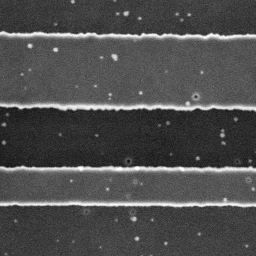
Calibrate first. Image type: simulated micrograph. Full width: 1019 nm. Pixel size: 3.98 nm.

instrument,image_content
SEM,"lines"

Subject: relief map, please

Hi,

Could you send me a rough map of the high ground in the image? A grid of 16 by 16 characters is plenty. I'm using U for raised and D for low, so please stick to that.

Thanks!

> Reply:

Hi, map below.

DDDDDDDDDDDDDDDD
DDDDDDDDDDDDDDDD
UUUUUUUUUUUUUUUU
UUUUUUUUUUUUUUUU
UUUUUUUUUUUUUUUU
UUUUUUUUUUUUUUUU
UUUUUUUUUUUUUUUU
DDDDDDDDDDDDDDDD
DDDDDDDDDDDDDDDD
DDDDDDDDDDDDDDDD
UUDDUUDDUDDDDDDD
UUUUUUUUUUUUUUUU
UUUUUUUUUUUUUUUU
DDDDDDDDDDDDDDDD
DDDDDDDDDDDDDDDD
DDDDDDDDDDDDDDDD